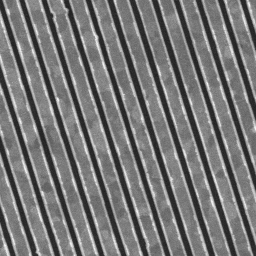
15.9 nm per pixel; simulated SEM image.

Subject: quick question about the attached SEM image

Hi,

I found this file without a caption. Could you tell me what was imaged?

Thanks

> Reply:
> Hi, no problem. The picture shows parallel lines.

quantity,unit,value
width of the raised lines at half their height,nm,215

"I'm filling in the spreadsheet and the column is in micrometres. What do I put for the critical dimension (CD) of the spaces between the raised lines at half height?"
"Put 0.122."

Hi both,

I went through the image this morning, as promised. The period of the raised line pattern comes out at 337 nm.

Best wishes